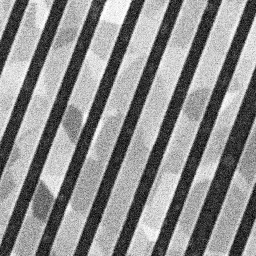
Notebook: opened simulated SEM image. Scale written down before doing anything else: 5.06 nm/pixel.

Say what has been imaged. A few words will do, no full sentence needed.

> parallel lines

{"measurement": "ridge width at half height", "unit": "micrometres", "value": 0.106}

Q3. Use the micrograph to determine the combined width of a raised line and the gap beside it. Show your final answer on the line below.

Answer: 182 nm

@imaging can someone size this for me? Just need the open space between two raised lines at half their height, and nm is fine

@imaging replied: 76.3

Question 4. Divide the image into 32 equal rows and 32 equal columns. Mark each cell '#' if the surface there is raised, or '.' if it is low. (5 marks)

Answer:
##..##..###..###..###..###..###.
#..###..###..###..###..##..###..
#..###..###..##..###..###..###..
#.###..###..###..###..###..##..#
..###..###..###..##..###..###..#
..###..##..###..###..###..###..#
.###..###..###..###..###.###..##
.###..###..##..###..###..###..##
.##..###..###..###..###..###..##
###..###..###..###..##..###..##.
###..##...##..###..###..###..##.
##..###..###..###..###..##..###.
##..###..###..##..###..###..##..
##.###..###..###..###..###..##..
#..###..###..###..###.###..##...
#..###..##..###..###..###..##...
..###..###..###..###..###.###..#
..###..###..###.###..###..##...#
..##..###..###..###..###..##...#
.###..###..###..###..##..###..##
.###..###..##..###..###..##...##
###..###..###..###..###..##...##
###..###..###..##..###..##...###
###..##..###..###..###..##...###
##..###..###..###..###..##..###.
##..###..###.###..###..##...###.
#..###..###..###..###..##...##..
#..###..###..###..##..###..###..
#..###..##..###..###..##...###..
..###..###..###..###..##..###..#
..###..###..##..###..##...###..#
..##..###..###..###..##...###..#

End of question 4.